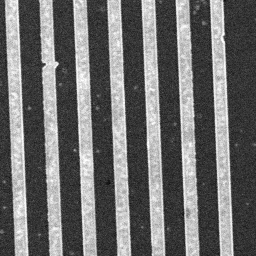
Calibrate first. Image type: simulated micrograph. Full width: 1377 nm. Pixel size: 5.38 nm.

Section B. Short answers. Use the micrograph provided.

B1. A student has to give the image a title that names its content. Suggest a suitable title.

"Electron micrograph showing parallel lines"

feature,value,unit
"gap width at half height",117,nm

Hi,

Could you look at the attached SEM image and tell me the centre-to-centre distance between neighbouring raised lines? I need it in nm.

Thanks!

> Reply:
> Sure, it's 184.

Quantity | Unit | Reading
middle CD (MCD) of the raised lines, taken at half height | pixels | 12.7